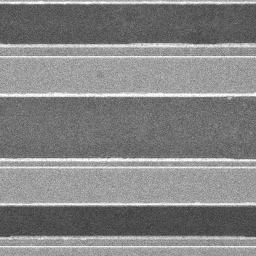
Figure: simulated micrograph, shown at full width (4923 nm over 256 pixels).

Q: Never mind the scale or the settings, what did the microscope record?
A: lines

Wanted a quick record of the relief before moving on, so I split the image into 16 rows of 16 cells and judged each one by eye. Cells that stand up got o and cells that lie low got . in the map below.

................
................
................
oooooooooooooooo
oooooooooooooooo
oooooooooooooooo
................
................
................
................
oooooooooooooooo
oooooooooooooooo
oooooooooooooooo
................
................
oooooooooooooooo